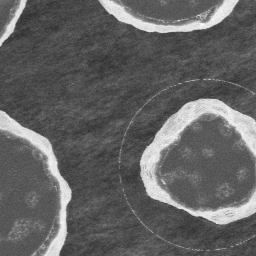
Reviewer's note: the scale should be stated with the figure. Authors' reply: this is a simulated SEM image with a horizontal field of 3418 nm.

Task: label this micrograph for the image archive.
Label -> raised bodies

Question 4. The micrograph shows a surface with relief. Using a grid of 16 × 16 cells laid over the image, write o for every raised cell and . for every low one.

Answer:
o......ooooooo..
o.......ooooo...
................
................
................
................
................
............ooo.
oo.........ooooo
ooo.......oooooo
ooo......ooooooo
oooo.....ooooooo
oooo......oooooo
oooo.........oo.
oooo............
ooo.............